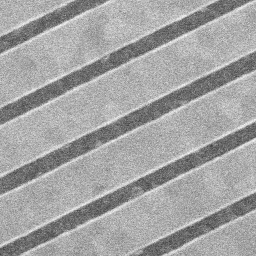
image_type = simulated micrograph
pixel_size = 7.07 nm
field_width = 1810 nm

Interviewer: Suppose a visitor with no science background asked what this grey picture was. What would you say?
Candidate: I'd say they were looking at one or a few lines or trenches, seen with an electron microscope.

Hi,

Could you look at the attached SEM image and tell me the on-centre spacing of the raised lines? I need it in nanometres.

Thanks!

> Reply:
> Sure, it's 445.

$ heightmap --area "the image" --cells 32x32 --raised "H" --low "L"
HHHHHHHHLLLLLHHHHHHHHHHHHHLLLLLH
HHHHHHLLLLLHHHHHHHHHHHHHLLLLLHHH
HHHHLLLLLHHHHHHHHHHHHHLLLLLHHHHH
HHLLLLLHHHHHHHHHHHHHLLLLLHHHHHHH
LLLLLHHHHHHHHHHHHHLLLLLHHHHHHHHH
LLLHHHHHHHHHHHHHLLLLLHHHHHHHHHHH
LHHHHHHHHHHHHHLLLLLHHHHHHHHHHHHH
HHHHHHHHHHHHLLLLLHHHHHHHHHHHHHLL
HHHHHHHHHHLLLLLHHHHHHHHHHHHHLLLL
HHHHHHHHLLLLLHHHHHHHHHHHHHLLLLLH
HHHHHHLLLLLHHHHHHHHHHHHLLLLLHHHH
HHHHLLLLLHHHHHHHHHHHHLLLLLHHHHHH
HHLLLLLHHHHHHHHHHHHLLLLLHHHHHHHH
LLLLLHHHHHHHHHHHHLLLLLHHHHHHHHHH
LLLHHHHHHHHHHHHLLLLLHHHHHHHHHHHH
HHHHHHHHHHHHHLLLLLHHHHHHHHHHHHHL
HHHHHHHHHHHLLLLLHHHHHHHHHHHHHLLL
HHHHHHHHHLLLLLHHHHHHHHHHHHHLLLLL
HHHHHHHLLLLLHHHHHHHHHHHHHLLLLLHH
HHHHHLLLLLHHHHHHHHHHHHHLLLLLHHHH
HHHLLLLLHHHHHHHHHHHHHLLLLLHHHHHH
HLLLLLHHHHHHHHHHHHHLLLLLHHHHHHHH
LLLLHHHHHHHHHHHHHLLLLLHHHHHHHHHH
LLHHHHHHHHHHHHHLLLLHHHHHHHHHHHHH
HHHHHHHHHHHHHLLLHHHHHHHHHHHHHHHL
HHHHHHHHHHHLLLLLHHHHHHHHHHHHHLLL
HHHHHHHHHLLLLLHHHHHHHHHHHHHLLLLH
HHHHHHHLLLLLHHHHHHHHHHHHHLLLLHHH
HHHHHLLLLHHHHHHHHHHHHHHLLLLHHHHH
HHHLLLLHHHHHHHHHHHHHHLLLLHHHHHHH
HLLLLHHHHHHHHHHHHHHLLLLHHHHHHHHH
LLLHHHHHHHHHHHHHHLLLLHHHHHHHHHHH